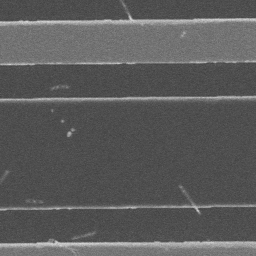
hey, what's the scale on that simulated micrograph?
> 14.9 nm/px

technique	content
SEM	lines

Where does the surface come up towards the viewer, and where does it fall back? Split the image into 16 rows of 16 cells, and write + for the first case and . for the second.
................
++++++++++++++++
++++++++++++++++
++++++++++++++++
................
................
++++++++++++++++
++++++++++++++++
++++++++++++++++
++++++++++++++++
++++++++++++++++
++++++++++++++++
++++++++++++++++
................
................
++++++++++++++++